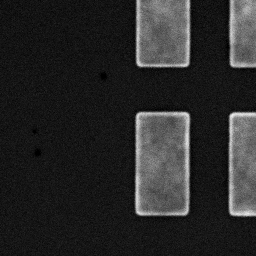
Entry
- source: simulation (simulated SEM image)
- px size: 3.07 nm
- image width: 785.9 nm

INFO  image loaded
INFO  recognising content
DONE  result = wiring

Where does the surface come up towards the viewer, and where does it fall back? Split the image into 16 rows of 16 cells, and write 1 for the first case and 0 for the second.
0000000001110011
0000000001110011
0000000001110011
0000000001110011
0000000000000000
0000000000000000
0000000000000000
0000000001110011
0000000001110011
0000000001110011
0000000001110011
0000000001110011
0000000001110011
0000000000000000
0000000000000000
0000000000000000